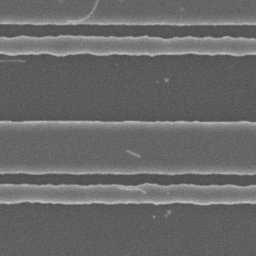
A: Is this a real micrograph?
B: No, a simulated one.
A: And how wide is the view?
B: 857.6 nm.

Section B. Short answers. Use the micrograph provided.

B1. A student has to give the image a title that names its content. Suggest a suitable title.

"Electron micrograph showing lines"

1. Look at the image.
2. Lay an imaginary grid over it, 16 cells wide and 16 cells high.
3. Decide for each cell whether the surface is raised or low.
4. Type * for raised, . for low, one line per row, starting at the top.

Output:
****************
****************
****************
................
................
................
................
................
****************
****************
****************
****************
****************
................
................
................